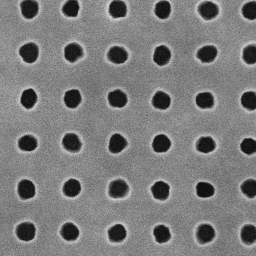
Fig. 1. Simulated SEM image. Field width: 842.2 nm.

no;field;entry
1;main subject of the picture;a regular array of holes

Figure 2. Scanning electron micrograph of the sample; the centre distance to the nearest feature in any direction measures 143 nanometers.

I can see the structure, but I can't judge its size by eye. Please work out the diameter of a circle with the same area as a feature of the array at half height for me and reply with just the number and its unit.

58.4 nm